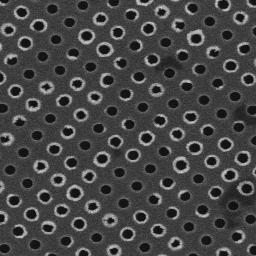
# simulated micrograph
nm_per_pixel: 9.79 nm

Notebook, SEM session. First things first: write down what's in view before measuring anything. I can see a regular array of holes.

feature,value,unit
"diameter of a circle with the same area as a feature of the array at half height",94.4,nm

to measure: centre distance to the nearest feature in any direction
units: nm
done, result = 212